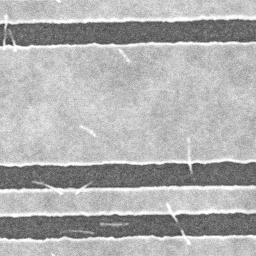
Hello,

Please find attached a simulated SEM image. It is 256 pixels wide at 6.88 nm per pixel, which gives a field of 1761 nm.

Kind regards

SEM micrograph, lines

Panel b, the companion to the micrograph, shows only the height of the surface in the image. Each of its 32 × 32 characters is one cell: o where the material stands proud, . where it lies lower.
oooooooooooooooooooooooooooooooo
oooooooooooooooooooooooooooooooo
oooooooooooooooooooooooo........
................................
................................
...........o.....ooooooooooooooo
oooooooooooooooooooooooooooooooo
oooooooooooooooooooooooooooooooo
oooooooooooooooooooooooooooooooo
oooooooooooooooooooooooooooooooo
oooooooooooooooooooooooooooooooo
oooooooooooooooooooooooooooooooo
oooooooooooooooooooooooooooooooo
oooooooooooooooooooooooooooooooo
oooooooooooooooooooooooooooooooo
oooooooooooooooooooooooooooooooo
oooooooooooooooooooooooooooooooo
oooooooooooooooooooooooooooooooo
oooooooooooooooooooooooooooooooo
oooooooooooooooooooooooooooooooo
oooooooooooo...........o........
................................
................................
......o..........ooooooooooooooo
oooooooooooooooooooooooooooooooo
oooooooooooooooooooooooooooooooo
oooooooooooooooooooooooooooooooo
................................
................................
..................o...oo....oooo
oooooooooooooooooooooooooooooooo
oooooooooooooooooooooooooooooooo